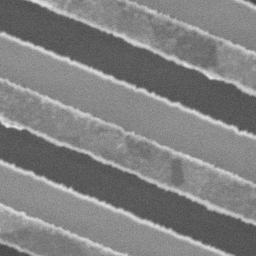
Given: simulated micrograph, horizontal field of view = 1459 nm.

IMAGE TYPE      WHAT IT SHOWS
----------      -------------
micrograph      lines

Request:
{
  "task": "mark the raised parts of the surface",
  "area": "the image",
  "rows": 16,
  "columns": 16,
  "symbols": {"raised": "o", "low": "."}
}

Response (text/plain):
...ooooooooooooo
.....ooooooooooo
o.......oooooooo
oooo......oooooo
oooooo.......ooo
ooooooooo......o
ooooooooooo.....
ooooooooooooo...
...ooooooooooooo
.....ooooooooooo
o.......oooooooo
ooo.......oooooo
oooooo......oooo
oooooooo.......o
ooooooooooo.....
.oooooooooooo...